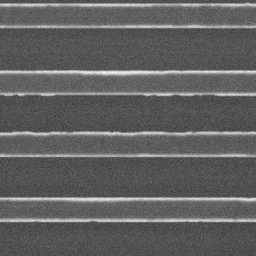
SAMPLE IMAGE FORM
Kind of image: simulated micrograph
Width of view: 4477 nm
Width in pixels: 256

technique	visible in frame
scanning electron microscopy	lines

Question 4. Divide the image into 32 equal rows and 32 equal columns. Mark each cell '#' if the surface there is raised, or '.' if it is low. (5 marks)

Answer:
................................
################################
################################
................................
................................
................................
................................
................................
................................
################################
################################
################################
................................
................................
................................
................................
................................
################################
################################
################################
................................
................................
................................
................................
................................
################################
################################
################################
................................
................................
................................
................................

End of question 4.